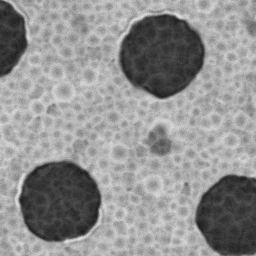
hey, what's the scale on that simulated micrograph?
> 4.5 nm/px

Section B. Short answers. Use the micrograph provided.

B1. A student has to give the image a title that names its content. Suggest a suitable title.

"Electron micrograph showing holes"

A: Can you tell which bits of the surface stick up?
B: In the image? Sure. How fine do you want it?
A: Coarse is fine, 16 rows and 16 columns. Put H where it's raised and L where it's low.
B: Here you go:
LHHHHHHHHHHHHHHH
LLHHHHHHLLLLHHHH
LLHHHHHHLLLLLHHH
LHHHHHHLLLLLLHHH
LHHHHHHHLLLLHHHH
HHHHHHHHHLLLHHHH
HHHHHHHHHHHHHHHH
HHHHHHHHHHHHHHHH
HHHHHHHHHHHHHHHH
HHHHHHHHHHHHHHHH
HHLLLHHHHHHHHHHH
HLLLLLHHHHHHHLLL
HLLLLLHHHHHHHLLL
HLLLLLHHHHHHLLLL
HHLLLLHHHHHHHLLL
HHHHHHHHHHHHHLLL